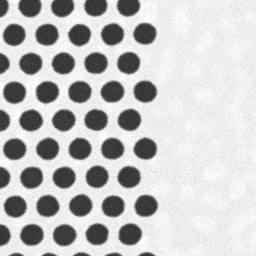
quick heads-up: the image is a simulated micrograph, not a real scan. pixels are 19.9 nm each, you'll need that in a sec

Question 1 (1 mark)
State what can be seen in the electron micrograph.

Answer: a regular array of holes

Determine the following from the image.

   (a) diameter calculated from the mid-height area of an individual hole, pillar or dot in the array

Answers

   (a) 0.469 micrometres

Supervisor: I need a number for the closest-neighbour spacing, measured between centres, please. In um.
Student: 0.644